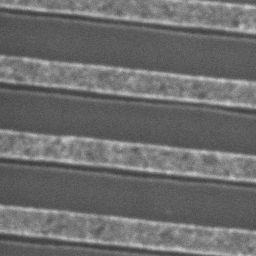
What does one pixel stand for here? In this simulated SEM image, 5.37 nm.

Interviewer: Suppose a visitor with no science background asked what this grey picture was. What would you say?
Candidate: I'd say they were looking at lines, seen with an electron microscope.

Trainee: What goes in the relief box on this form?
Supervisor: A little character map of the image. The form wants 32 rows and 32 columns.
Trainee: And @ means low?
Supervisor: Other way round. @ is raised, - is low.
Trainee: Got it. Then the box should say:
@@@@@@@@@@@@@@@@@@@@@@@@@@@@@---
-------@@@@@@@@@@@@@@@@@@@@@@@@@
-----------------@@@@@@@@@@@@@@@
---------------------------@@@@@
--------------------------------
--------------------------------
--------------------------------
@@@@@---------------------------
@@@@@@@@@@@@@@------------------
@@@@@@@@@@@@@@@@@@@@@@@---------
---@@@@@@@@@@@@@@@@@@@@@@@@@@@@@
------------@@@@@@@@@@@@@@@@@@@@
----------------------@@@@@@@@@@
--------------------------------
--------------------------------
--------------------------------
@@------------------------------
@@@@@@@@@@@@--------------------
@@@@@@@@@@@@@@@@@@@@@@----------
-@@@@@@@@@@@@@@@@@@@@@@@@@@@@@@@
-----------@@@@@@@@@@@@@@@@@@@@@
--------------------@@@@@@@@@@@@
-------------------------------@
--------------------------------
--------------------------------
--------------------------------
@@@@@@@@@-----------------------
@@@@@@@@@@@@@@@@@---------------
@@@@@@@@@@@@@@@@@@@@@@@@@@------
------@@@@@@@@@@@@@@@@@@@@@@@@@@
--------------@@@@@@@@@@@@@@@@@@
------------------------@@@@@@@@